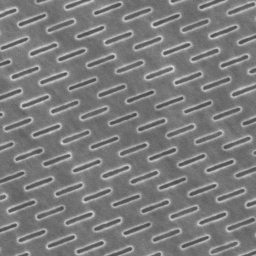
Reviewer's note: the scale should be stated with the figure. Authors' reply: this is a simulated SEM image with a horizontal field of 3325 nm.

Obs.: a regular array of holes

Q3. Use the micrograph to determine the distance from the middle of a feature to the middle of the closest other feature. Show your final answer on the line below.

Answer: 0.375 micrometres